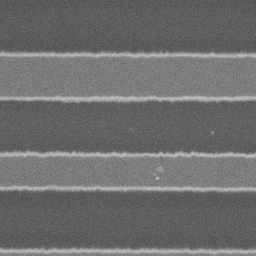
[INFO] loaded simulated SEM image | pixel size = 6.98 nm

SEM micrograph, lines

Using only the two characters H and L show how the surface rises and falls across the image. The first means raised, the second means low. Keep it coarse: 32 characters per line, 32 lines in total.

LLLLLLLLLLLLLLLLLLLLLLLLLLLLLLLL
LLLLLLLLLLLLLLLLLLLLLLLLLLLLLLLL
LLLLLLLLLLLLLLLLLLLLLLLLLLLLLLLL
LLLLLLLLLLLLLLLLLLLLLLLLLLLLLLLL
LLLLLLLLLLLLLLLLLLLLLLLLLLLLLLLL
LLLLLLLLLLLLLLLLLLLLLLLLLLLLLLLL
LLLLLLLLLLLLLLLLLLLLLLLLLLLLLLLL
HHHHHHHHHHHHHHHHHHHHHHHHHHHHHHHH
HHHHHHHHHHHHHHHHHHHHHHHHHHHHHHHH
HHHHHHHHHHHHHHHHHHHHHHHHHHHHHHHH
HHHHHHHHHHHHHHHHHHHHHHHHHHHHHHHH
HHHHHHHHHHHHHHHHHHHHHHHHHHHHHHHH
LLLLLLLLLLLLLLLLLLLLLLLLLLLLLLLL
LLLLLLLLLLLLLLLLLLLLLLLLLLLLLLLL
LLLLLLLLLLLLLLLLLLLLLLLLLLLLLLLL
LLLLLLLLLLLLLLLLLLLLLLLLLLLLLLLL
LLLLLLLLLLLLLLLLLLLLLLLLLLLLLLLL
LLLLLLLLLLLLLLLLLLLLLLLLLLLLLLLL
LLLLLLLLLLLLLLLLLLLLLLLLLLLLLLLL
HHHHHHHHHHHHHHHHHHHHHHHHHHHHHHHH
HHHHHHHHHHHHHHHHHHHHHHHHHHHHHHHH
HHHHHHHHHHHHHHHHHHHHHHHHHHHHHHHH
HHHHHHHHHHHHHHHHHHHHHHHHHHHHHHHH
LLLLHLLLLHHHLHHHLLHHHHHHHHHHHHHH
LLLLLLLLLLLLLLLLLLLLLLLLLLLLLLLL
LLLLLLLLLLLLLLLLLLLLLLLLLLLLLLLL
LLLLLLLLLLLLLLLLLLLLLLLLLLLLLLLL
LLLLLLLLLLLLLLLLLLLLLLLLLLLLLLLL
LLLLLLLLLLLLLLLLLLLLLLLLLLLLLLLL
LLLLLLLLLLLLLLLLLLLLLLLLLLLLLLLL
LLLLLLLLLLLLLLLLLLLLLLLLLLLLLLLL
HHHHHHHHHHHHHHHHHHHHLHLHLHHHLHLL